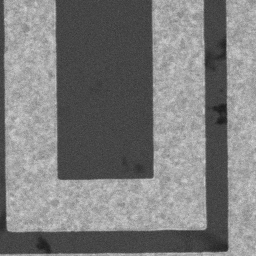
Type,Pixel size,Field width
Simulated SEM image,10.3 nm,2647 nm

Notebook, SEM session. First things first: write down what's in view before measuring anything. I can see groups of lines, slits or small figures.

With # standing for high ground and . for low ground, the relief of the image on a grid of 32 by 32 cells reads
.######............######...####
.######............######...####
.######............######...####
.######............######...####
.######............######...####
.######............######...####
.######............######...####
.######............######...####
.######............######....###
.######............######....###
.######............######....###
.######............######....###
.######............######....###
.######............######....###
.######............######....###
.######............#######...###
.######............#######...###
.######............#######...###
.######............#######...###
.######............#######...###
.######............#######...###
.######............#######...###
.#######....##############...###
.#########################...###
.#########################...###
.#########################...###
.#########################...###
.#########################...###
.########################....###
.............................###
.............................###
............................####